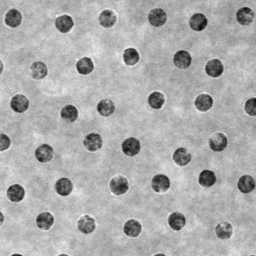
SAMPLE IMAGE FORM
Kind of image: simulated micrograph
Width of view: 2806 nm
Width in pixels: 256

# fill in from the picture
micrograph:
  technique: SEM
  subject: a regular array of holes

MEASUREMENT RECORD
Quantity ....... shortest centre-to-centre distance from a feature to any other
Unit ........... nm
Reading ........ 429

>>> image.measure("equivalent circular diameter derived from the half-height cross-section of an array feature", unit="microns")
0.206